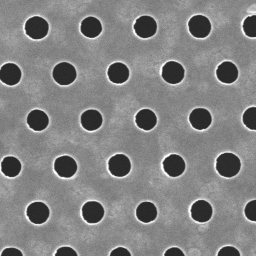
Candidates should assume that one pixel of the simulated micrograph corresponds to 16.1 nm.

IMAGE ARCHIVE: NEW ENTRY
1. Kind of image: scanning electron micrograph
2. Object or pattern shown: a regular array of holes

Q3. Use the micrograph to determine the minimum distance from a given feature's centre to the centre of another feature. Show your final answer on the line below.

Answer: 857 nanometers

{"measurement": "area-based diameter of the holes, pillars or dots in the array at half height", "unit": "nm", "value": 359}